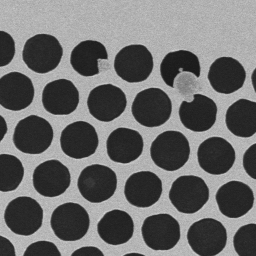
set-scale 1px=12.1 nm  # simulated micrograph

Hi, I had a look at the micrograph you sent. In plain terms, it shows a regular array of holes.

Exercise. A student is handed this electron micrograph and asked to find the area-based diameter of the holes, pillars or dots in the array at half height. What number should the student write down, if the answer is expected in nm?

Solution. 462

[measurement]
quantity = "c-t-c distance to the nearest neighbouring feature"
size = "45.9 pixels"